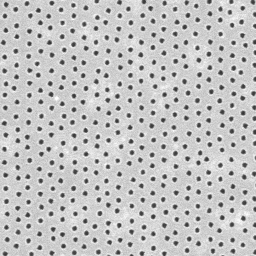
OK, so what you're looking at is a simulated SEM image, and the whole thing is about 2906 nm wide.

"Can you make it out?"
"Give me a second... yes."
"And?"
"a regular array of holes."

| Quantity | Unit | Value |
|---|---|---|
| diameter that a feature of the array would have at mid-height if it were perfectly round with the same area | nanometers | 60.1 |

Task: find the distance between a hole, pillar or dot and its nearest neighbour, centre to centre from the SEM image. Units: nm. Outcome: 128